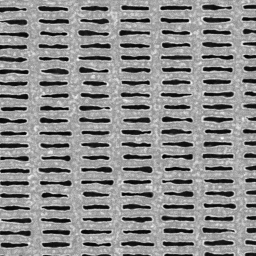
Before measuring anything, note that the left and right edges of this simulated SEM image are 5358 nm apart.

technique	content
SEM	a regular array of holes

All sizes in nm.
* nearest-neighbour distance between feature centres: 260